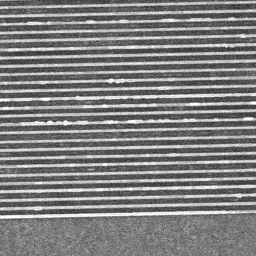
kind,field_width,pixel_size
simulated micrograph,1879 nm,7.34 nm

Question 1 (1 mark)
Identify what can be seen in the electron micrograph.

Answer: parallel lines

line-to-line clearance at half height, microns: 0.0477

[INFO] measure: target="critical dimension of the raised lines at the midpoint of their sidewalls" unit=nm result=13.8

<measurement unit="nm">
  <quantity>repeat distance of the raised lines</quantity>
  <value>61.4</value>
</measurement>